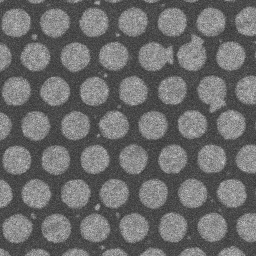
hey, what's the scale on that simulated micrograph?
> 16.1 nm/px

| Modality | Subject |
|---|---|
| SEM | a regular array of raised bodies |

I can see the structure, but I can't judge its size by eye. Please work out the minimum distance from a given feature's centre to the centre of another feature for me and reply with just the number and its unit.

624 nm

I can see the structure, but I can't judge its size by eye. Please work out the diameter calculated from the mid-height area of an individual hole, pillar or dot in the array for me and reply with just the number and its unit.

445 nm